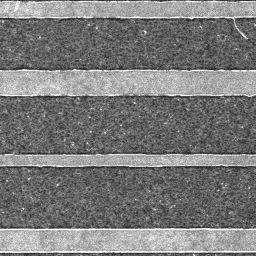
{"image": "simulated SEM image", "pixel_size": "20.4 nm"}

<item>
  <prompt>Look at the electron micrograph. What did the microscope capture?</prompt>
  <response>one or a few lines or trenches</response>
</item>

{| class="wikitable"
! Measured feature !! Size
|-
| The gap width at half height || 1.21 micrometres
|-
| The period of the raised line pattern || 1570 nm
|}